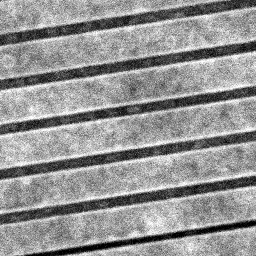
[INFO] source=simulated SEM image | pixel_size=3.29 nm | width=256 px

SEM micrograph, parallel lines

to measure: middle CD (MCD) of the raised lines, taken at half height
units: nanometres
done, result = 105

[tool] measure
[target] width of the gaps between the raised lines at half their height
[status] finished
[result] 0.0407 um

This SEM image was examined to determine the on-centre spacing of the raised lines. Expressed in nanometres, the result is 146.